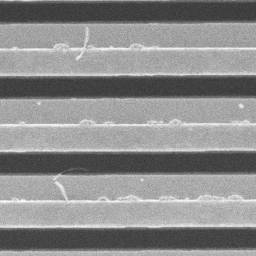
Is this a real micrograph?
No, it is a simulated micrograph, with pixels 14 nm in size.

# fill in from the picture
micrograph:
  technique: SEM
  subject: lines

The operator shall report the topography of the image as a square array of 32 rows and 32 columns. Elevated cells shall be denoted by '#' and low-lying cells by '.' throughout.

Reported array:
................................
................................
................................
################################
################################
################################
################################
################################
################################
...##...........................
................................
................................
################################
################################
################################
################################
################################
################################
################################
................................
................................
................................
################################
################################
################################
################################
################################
################################
................................
................................
................................
################################